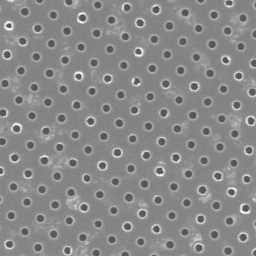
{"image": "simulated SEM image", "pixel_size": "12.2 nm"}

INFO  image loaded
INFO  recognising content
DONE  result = a regular array of holes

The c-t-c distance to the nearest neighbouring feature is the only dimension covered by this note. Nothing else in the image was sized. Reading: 244 nm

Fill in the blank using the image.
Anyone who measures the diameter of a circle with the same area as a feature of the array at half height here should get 91.3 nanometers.